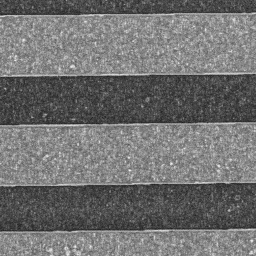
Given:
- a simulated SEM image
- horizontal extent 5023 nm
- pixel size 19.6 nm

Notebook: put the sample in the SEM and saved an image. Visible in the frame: lines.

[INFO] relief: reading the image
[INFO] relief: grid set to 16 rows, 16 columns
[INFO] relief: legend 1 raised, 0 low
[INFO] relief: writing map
0000000000000000
1111111111111111
1111111111111111
1111111111111111
1111111111111111
0000000000000000
0000000000000000
0000000000000000
1111111111111111
1111111111111111
1111111111111111
1111111110000000
0000000000000000
0000000000000000
0000111111111111
1111111111111111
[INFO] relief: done